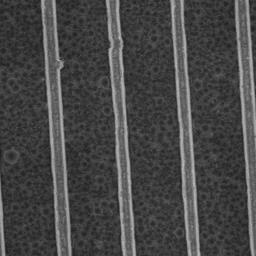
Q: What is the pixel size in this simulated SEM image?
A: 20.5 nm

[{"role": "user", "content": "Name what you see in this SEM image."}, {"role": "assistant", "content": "one or a few lines or trenches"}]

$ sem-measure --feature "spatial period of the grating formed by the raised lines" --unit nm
1310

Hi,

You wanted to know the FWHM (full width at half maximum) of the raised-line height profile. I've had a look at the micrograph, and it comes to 207 nm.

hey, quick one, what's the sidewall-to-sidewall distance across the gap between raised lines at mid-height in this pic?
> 1110 nm